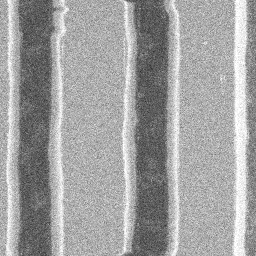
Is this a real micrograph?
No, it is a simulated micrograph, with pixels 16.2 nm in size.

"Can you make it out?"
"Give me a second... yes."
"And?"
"one or a few lines or trenches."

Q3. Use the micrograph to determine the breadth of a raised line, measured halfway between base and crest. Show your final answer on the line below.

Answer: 1120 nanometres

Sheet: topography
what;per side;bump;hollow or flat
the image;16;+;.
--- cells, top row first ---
+...++++...++++.
+...++++...++++.
+...++++...++++.
+...++++...++++.
+...++++...++++.
+...++++...++++.
+...++++...++++.
+..+++++...++++.
+..+++++...++++.
+..+++++...++++.
+..+++++...++++.
+...++++...++++.
+...++++...++++.
+...++++...++++.
+...++++...++++.
+...++++...++++.